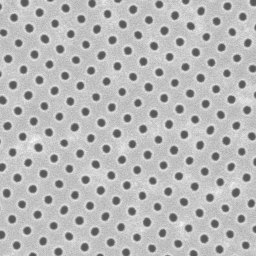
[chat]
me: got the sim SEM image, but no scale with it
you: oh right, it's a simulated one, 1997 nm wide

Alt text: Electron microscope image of a regular array of holes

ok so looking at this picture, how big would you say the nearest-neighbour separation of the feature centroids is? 144 nanometers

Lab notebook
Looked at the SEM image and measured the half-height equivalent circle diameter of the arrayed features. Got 66.4 nm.